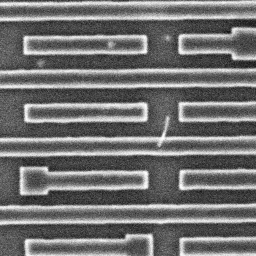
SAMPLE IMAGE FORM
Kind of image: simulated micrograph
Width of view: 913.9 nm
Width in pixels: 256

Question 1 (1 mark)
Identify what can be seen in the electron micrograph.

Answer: wiring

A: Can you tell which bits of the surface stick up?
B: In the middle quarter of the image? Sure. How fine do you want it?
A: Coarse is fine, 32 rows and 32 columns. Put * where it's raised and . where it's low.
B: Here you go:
................................
................................
********************************
********************************
********************************
*******************************.
................................
................................
................................
................................
*********************........***
*********************........***
*********************........***
*********************........***
................................
................................
................................
................................
........................*.......
********************************
********************************
********************************
***************........***......
................................
................................
................................
................................
*********************........***
*********************........***
*********************........***
*********************........***
................................